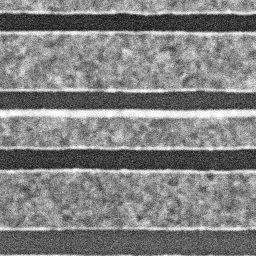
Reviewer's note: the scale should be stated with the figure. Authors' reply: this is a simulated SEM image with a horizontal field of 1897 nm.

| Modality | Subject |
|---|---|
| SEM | lines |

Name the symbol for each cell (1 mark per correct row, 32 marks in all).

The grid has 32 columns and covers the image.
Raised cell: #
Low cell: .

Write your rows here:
################################
################################
................................
................................
################################
################################
################################
################################
################################
################################
################################
................................
................................
................................
################################
################################
################################
################################
################################
................................
................................
################################
################################
################################
################################
################################
################################
################################
################################
................................
................................
................................